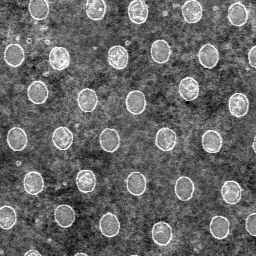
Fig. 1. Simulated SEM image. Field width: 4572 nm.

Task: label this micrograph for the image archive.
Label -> a regular array of holes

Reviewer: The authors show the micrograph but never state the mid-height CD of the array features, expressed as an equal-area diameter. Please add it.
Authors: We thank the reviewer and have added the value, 0.371 um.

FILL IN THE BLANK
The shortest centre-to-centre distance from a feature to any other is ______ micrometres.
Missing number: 0.811